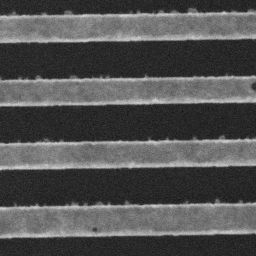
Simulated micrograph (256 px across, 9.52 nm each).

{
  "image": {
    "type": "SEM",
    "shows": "lines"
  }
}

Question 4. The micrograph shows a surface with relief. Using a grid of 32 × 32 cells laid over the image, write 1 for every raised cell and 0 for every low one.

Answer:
00000000000000000000000000000000
00000000000000000000000000000000
11111111111111111111111111111111
11111111111111111111111111111111
11111111111111111111111111111111
00000000000000000000000000000000
00000000000000000000000000000000
00000000000000000000000000000000
00000000000000000000000000000000
00000000000000000000000000000000
11111111111111111111111111111111
11111111111111111111111111111111
11111111111111111111111111111111
00000000000000000000000000000000
00000000000000000000000000000000
00000000000000000000000000000000
00000000000000000000000000000000
00000000000000000000000000000100
11111111111111111111111111111111
11111111111111111111111111111111
11111111111111111111111111111001
00000000000000000000000000000000
00000000000000000000000000000000
00000000000000000000000000000000
00000000000000000000000000000000
00000000000000000000000000000011
11111111111111111111111111111111
11111111111111111111111111111111
11111111111111111111111111111111
11111100000000000000000000000000
00000000000000000000000000000000
00000000000000000000000000000000